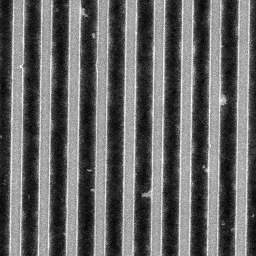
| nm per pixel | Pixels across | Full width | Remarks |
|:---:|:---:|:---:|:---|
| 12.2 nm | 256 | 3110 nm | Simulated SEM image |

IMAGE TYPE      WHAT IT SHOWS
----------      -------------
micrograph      parallel lines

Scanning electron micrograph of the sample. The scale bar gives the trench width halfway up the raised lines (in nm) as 120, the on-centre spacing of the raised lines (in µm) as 0.341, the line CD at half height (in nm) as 225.